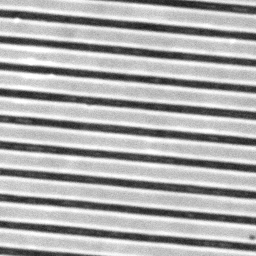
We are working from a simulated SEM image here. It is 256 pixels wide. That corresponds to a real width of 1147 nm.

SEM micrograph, parallel lines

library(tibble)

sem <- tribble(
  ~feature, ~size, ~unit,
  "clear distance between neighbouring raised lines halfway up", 0.0418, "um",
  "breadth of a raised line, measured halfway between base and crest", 75.9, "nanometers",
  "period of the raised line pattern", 118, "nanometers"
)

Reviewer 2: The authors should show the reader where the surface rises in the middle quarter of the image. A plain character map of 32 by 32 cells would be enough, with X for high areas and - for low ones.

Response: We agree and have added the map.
XXXXXXXXXXXXXXXXXXXXXXXXXXXXXXXX
---------XXXXXXXXXXXXXXXXXXXXXXX
--------------------XXXXXXXXXXXX
XXX---------------------------XX
XXXXXXXXXXXXXX------------------
XXXXXXXXXXXXXXXXXXXXXXXXX-------
XXXXXXXXXXXXXXXXXXXXXXXXXXXXXXXX
--XXXXXXXXXXXXXXXXXXXXXXXXXXXXXX
-------------XXXXXXXXXXXXXXXXXXX
------------------------XXXXXXXX
XXXXXX--------------------------
XXXXXXXXXXXXXXXXXX--------------
XXXXXXXXXXXXXXXXXXXXXXXXXXXXX---
XXXXXXXXXXXXXXXXXXXXXXXXXXXXXXXX
-------X-XXXXXXXXXXXXXXXXXXXXXXX
------------------XXXXXXXXXXXXXX
X---------------------------XXXX
XXXXXXXXX-----------------------
XXXXXXXXXXXXXXXXXXXX-XX---------
XXXXXXXXXXXXXXXXXXXXXXXXXXXXXXX-
XXXXXXXXXXXXXXXXXXXXXXXXXXXXXXXX
--------------XXXXXXXXXXXXXXXXXX
------------------------XXXXXXXX
XXXXX---------------------------
XXXXXXXXXXXXXXXX----------------
XXXXXXXXXXXXXXXXXXXXXXXXXXX-----
XXXXXXXXXXXXXXXXXXXXXXXXXXXXXXXX
-----XXXXXXXXXXXXXXXXXXXXXXXXXXX
----------------XXXXXXXXXXXXXXXX
--------------------------XXXXXX
XXXXXXXXXX----------------------
XXXXXXXXXXXXXXXXXX--------------